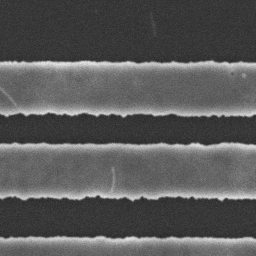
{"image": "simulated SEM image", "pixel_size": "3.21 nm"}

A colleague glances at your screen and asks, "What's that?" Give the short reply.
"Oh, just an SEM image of lines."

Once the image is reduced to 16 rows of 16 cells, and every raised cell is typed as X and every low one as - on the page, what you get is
----------------
----------------
----------------
----------------
XXXXXXXXXXXXXXXX
XXXXXXXXXXXXXXXX
XXXXXXXXXXXXXXXX
----------------
----------------
XXXXXXXXXXXXXXXX
XXXXXXXXXXXXXXXX
XXXXXXXXXXXXXXXX
----------------
----------------
----------------
XXXXXXXXXXXXXXXX